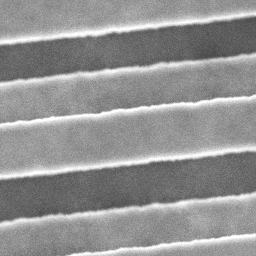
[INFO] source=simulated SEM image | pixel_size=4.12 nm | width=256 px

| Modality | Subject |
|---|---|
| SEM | lines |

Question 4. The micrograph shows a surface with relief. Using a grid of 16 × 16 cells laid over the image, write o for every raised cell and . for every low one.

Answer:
oooooooooooooooo
ooooooooooo.....
oo..............
...............o
......oooooooooo
oooooooooooooooo
oooooooooooooooo
oooooooooooooooo
oooooooooooooooo
oooooooooooooo..
oooooo..........
................
.............ooo
....oooooooooooo
oooooooooooooooo
oooooooooooooooo